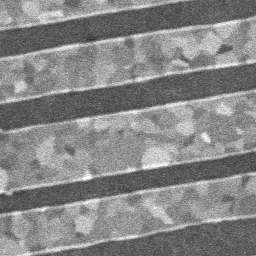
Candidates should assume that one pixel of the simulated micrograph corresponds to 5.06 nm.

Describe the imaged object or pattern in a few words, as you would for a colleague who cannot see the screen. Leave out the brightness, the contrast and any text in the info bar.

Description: one or a few lines or trenches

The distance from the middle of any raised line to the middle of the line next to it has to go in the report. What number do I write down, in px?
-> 77.4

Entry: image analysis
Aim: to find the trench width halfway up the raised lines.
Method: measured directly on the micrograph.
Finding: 0.144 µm